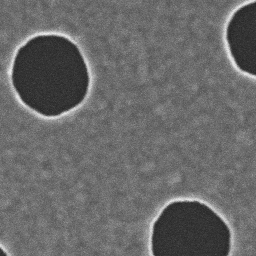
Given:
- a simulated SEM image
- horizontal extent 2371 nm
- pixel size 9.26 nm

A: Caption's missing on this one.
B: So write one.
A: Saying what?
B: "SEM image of holes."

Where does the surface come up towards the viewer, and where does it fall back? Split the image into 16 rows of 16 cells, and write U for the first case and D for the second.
UUUUUUUUUUUUUUUD
UUUUUUUUUUUUUUDD
UUDDUUUUUUUUUUDD
UDDDDUUUUUUUUUUD
UDDDDDUUUUUUUUUD
UDDDDUUUUUUUUUUU
UUDDDUUUUUUUUUUU
UUUUUUUUUUUUUUUU
UUUUUUUUUUUUUUUU
UUUUUUUUUUUUUUUU
UUUUUUUUUUUUUUUU
UUUUUUUUUUUUUUUU
UUUUUUUUUUUUUUUU
UUUUUUUUUUDDDDUU
UUUUUUUUUUDDDDUU
UUUUUUUUUDDDDDUU